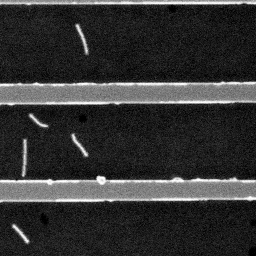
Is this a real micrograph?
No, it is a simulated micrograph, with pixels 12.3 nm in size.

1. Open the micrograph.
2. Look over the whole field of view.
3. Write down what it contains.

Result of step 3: lines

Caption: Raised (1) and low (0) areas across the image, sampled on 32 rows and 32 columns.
00000000000000000000000000000000
00000000000000000000000000000000
00000000000000000000000000000000
00000000000000000000000000000000
00000000000000000000000000000000
00000000000000000000000000000000
00000000000000000000000000000000
00000000000000000000000000000000
00000000000000000000000000000000
00000000000000000000000000000000
00101000011101111111111111111111
11111111111111111111111111111111
11111111111111111111111111111111
00000000000000000000000000000000
00000000000000000000000000000000
00000000000000000000000000000000
00000000000000000000000000000000
00000000000000000000000000000000
00000000000000000000000000000000
00000000000000000000000000000000
00000000000000000000000000000000
00000000000000000000000000000000
00000000000011000000000000000000
11111111111111111111111111111111
11111111111111111111111111111111
00000000000000000000000000000000
00000000000000000000000000000000
00000000000000000000000000000000
00000000000000000000000000000000
00000000000000000000000000000000
00000000000000000000000000000000
00000000000000000000000000000000